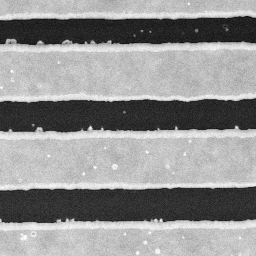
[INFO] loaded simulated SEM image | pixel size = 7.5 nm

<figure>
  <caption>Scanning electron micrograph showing lines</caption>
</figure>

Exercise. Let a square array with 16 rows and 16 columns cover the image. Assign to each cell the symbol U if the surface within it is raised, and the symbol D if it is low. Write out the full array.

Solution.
UUUUUUUUUUUUUUUU
DDDDDDDDDDDDDDDD
DDDDDDDDDDDDDDDD
UUUUUUUUUUUUUUUU
UUUUUUUUUUUUUUUU
UUUUUUUUUUUUUUUU
DDDDDDDDDDDDDDDD
DDDDDDDDDDDDDDDD
UUUUUUUUUUUUUUUU
UUUUUUUUUUUUUUUU
UUUUUUUUUUUUUUUU
UUUUUUUUUUUUUUUU
DDDDDDDDDDDDDDDD
DDDDDDDDDDDDDDDD
UUUUUUUUUUUUUUUU
UUUUUUUUUUUUUUUU